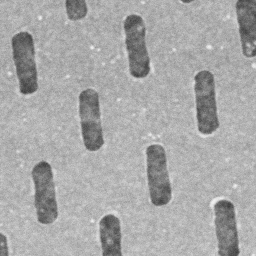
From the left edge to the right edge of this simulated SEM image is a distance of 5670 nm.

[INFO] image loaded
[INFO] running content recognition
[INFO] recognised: holes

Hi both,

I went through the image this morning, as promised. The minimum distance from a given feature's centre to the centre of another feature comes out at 1930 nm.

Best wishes